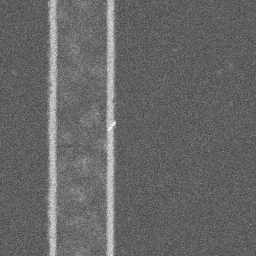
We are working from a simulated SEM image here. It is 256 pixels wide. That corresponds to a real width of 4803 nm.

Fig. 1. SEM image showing one or a few lines or trenches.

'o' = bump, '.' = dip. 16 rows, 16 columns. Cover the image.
ooo....ooooooooo
ooo....ooooooooo
ooo....ooooooooo
ooo....ooooooooo
ooo....ooooooooo
ooo....ooooooooo
ooo....ooooooooo
ooo....ooooooooo
ooo....ooooooooo
ooo....ooooooooo
ooo....ooooooooo
ooo....ooooooooo
ooo....ooooooooo
ooo....ooooooooo
ooo....ooooooooo
ooo....ooooooooo